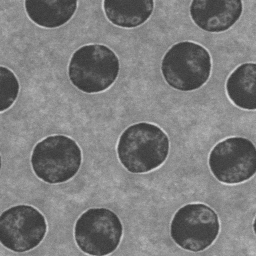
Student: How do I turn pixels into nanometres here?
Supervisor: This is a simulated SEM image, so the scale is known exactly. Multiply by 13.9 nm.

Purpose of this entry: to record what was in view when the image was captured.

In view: holes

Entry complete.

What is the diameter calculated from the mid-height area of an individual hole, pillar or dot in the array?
699 nanometres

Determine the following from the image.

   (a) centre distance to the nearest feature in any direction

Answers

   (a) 1290 nm